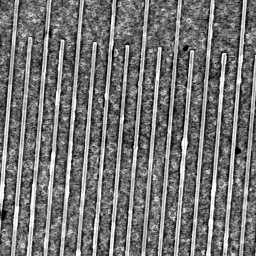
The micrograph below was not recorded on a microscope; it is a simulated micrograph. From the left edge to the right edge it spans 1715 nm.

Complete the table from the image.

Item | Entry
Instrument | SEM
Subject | parallel lines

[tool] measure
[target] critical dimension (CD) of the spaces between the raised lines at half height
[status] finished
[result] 85.1 nanometers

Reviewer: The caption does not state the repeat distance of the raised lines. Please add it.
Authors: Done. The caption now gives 109 nm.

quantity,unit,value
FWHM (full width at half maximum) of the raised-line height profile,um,0.0225